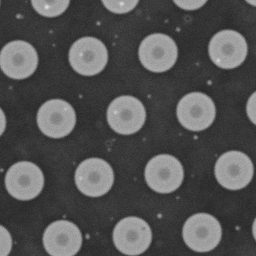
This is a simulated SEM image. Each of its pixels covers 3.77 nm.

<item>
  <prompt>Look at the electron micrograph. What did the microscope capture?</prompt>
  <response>an array of small figures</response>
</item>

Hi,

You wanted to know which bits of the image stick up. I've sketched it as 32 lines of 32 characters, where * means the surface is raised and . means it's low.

....*****....****.....***......*
.....***......**................
................................
................................
...................**......***..
.***.....****.....****....*****.
*****....****....*****....*****.
*****....****.....****....****..
****.....****.....***.......*...
.***............................
................................
................................
......**......***......***.....*
.....****.....****....*****....*
*....****....*****....*****....*
*....****.....****.....***......
.....****......**...............
................................
................................
....................*.......***.
..**......****....*****....*****
.****....*****....*****....*****
.****....*****....*****....****.
.****.....****.....***......**..
..***......**...................
................................
................................
...............***.....****.....
*.....****....*****....*****....
*....*****....*****....*****....
*....*****....*****....****.....
*.....****.....***..............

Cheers